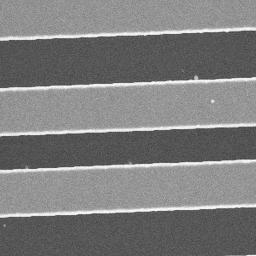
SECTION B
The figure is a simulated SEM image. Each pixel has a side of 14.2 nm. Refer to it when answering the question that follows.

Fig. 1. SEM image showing lines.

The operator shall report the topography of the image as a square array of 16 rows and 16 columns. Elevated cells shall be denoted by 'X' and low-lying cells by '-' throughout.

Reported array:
XXXXXXXXXXXXXXXX
XXXXXXXXXXXXXXXX
X---------------
----------------
----------------
XXXXXXXXXXXXXXXX
XXXXXXXXXXXXXXXX
XXXXXXXXXXXXXXXX
----------------
----------------
---XXXXXXXXXXXXX
XXXXXXXXXXXXXXXX
XXXXXXXXXXXXXXXX
XX--------------
----------------
----------------